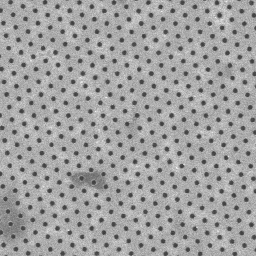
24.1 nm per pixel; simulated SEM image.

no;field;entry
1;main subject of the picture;a regular array of holes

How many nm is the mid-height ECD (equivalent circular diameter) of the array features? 112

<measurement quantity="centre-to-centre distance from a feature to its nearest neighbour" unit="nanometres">304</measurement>